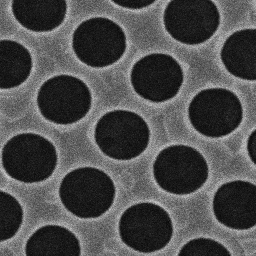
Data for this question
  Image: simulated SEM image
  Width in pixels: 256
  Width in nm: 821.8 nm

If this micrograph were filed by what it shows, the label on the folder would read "a regular array of holes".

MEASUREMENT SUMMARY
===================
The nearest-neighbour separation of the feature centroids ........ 67.2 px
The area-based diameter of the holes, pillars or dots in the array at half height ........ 169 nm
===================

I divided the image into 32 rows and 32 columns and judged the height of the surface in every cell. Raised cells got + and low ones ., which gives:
++......+++++++....++......+++++
++......+++++++++++++......+++++
++......+++...++++++.......+++++
+++....+++.....++++++......+++++
+++++++++.......+++++.....+++...
...++++++.......+++++++..+++....
....+++++.......++++++++++++....
....++++++.....++.....++++++....
....+++++++++++++......+++++....
....+++..+++++++.......++++++...
...++......+++++.......+++++++++
+++++......++++++.....+++....+++
+++++......+++++++...+++......++
+++++......+++++++++++++......++
+++++......++....+++++++......++
+++++++..+++......++++++......++
++++++++++++.......++++++....+++
+.....++++++.......++++++++++++.
.......+++++......+++...+++++++.
.......++++++....+++.....++++++.
.......++++++++++++.......++++++
+......++....++++++.......++++++
++....++......+++++.......++++++
+++++++.......++++++.....++.....
..+++++.......+++++++++++++.....
...+++++......+++..++++++++.....
...++++++....+++.....++++++.....
...++++++++++++......++++++.....
..+++...+++++++.......+++++++..+
..++.....++++++......+++++++++++
+++.......++++++.....++.....++++
+++.......+++++++..+++.......+++